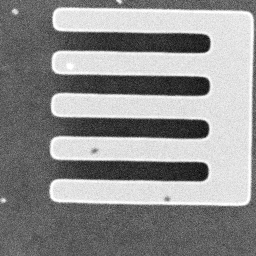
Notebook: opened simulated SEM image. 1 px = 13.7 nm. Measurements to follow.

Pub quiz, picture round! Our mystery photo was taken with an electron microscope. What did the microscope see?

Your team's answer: groups of lines, slits or small figures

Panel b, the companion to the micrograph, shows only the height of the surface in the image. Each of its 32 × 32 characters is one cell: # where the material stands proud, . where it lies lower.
................................
.......#######################..
.......#########################
.......#########################
..........................######
..........................######
..........................#####.
.......########################.
.......########################.
........................#######.
..........................#####.
..........................#####.
.......########################.
.......########################.
.........######################.
..........................#####.
..........................#####.
.......################..######.
......#########################.
.......########################.
..........................#####.
..........................#####.
.......##.................#####.
......#########################.
......#########################.
..........................#####.
................................
................................
................................
................................
................................
................................